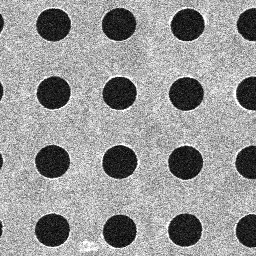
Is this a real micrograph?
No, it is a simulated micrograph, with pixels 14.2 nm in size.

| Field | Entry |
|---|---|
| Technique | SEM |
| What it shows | a regular array of holes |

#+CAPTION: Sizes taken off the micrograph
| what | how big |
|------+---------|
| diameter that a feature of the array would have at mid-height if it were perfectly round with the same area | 485 nm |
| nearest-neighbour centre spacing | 932 nm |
